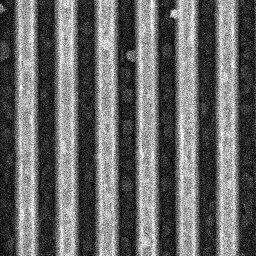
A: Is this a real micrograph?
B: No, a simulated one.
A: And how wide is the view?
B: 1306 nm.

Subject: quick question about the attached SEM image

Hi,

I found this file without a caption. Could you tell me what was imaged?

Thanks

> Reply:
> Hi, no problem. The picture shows parallel lines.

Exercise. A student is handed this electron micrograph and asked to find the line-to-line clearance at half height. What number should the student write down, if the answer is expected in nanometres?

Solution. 111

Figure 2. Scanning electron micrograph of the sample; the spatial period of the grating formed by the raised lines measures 205 nanometres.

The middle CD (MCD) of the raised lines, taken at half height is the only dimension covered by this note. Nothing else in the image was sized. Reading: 94.4 nanometers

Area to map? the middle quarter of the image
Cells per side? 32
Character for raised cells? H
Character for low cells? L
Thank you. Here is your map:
HHHLLLLLHHHHHLLLLLHHHHHLLLLLLHHH
HHHLLLLLHHHHHLLLLLHHHHHLLLLLLHHH
HHHLLLLLHHHHHLLLLLLHHHHLLLLLLHHH
HHHLLLLLHHHHHLLLLLLHHHHLLLLLLHHH
HHHLLLLLHHHHHLLLLLLHHHHLLLLLLHHH
HHHLLLLLHHHHHLLLLLLHHHHLLLLLLHHH
HHHLLLLLHHHHHLLLLLLHHHHLLLLLLHHH
HHHLLLLLHHHHHLLLLLLHHHHLLLLLLHHH
HHHLLLLLHHHHHLLLLLHHHHHLLLLLLHHH
HHHLLLLLHHHHHLLLLLHHHHHLLLLLLHHH
HHHLLLLLHHHHHLLLLLHHHHHLLLLLLHHH
HHHLLLLLHHHHHLLLLLHHHHHLLLLLLHHH
HHHLLLLLHHHHHLLLLLHHHHHLLLLLLHHH
HHHLLLLLLHHHHLLLLLHHHHHLLLLLLHHH
HHHLLLLLHHHHHLLLLLHHHHHLLLLLLHHH
HHHLLLLLHHHHHLLLLLLHHHHLLLLLLHHH
HHHLLLLLHHHHHLLLLLLHHHHLLLLLLHHH
HHHLLLLLHHHHHLLLLLLHHHHLLLLLLHHH
HHHLLLLLHHHHHLLLLLLHHHHLLLLLLHHH
HHHLLLLLHHHHHLLLLLLHHHHLLLLLLHHH
HHHLLLLLHHHHHLLLLLLHHHHLLLLLLHHH
HHHLLLLLHHHHHLLLLLLHHHHLLLLLLHHH
HHHLLLLLHHHHHLLLLLLHHHHLLLLLLHHH
HHHLLLLLHHHHHLLLLLLHHHHLLLLLLHHH
HHHLLLLLHHHHHLLLLLLHHHHLLLLLLHHH
HHHLLLLLHHHHHLLLLLLHHHHLLLLLLHHH
HHHLLLLLHHHHHLLLLLLHHHHLLLLLLHHH
HHHLLLLLHHHHHLLLLLLHHHHLLLLLLHHH
HHHLLLLLHHHHHLLLLLLHHHHLLLLLLHHH
HHHLLLLLHHHHHLLLLLLHHHHLLLLLLHHH
HHHLLLLLLHHHHLLLLLLHHHHLLLLLLHHH
HHHLLLLLLHHHHLLLLLLHHHHLLLLLLHHH